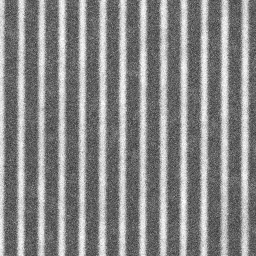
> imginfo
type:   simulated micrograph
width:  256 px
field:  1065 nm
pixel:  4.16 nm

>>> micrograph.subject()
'parallel lines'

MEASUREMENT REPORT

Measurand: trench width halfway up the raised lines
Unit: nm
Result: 66.5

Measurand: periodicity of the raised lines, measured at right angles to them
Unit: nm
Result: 84.5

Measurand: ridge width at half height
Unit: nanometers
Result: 16.1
